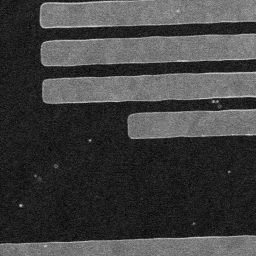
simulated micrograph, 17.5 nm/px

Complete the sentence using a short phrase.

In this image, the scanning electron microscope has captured groups of lines, slits or small figures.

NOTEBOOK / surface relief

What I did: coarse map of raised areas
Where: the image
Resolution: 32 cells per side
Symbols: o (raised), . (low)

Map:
......oooooooooooooooooooooooooo
.....ooooooooooooooooooooooooooo
.....ooooooooooooooooooooooooooo
................................
.........................ooooooo
.....ooooooooooooooooooooooooooo
.....ooooooooooooooooooooooooooo
.....ooooooooooooooooooooo......
................................
.................ooooooooooooooo
.....ooooooooooooooooooooooooooo
.....ooooooooooooooooooooooooooo
.....ooooooooooooooo............
................................
................oooooooooooooooo
................oooooooooooooooo
................oooooooooooooooo
................................
................................
................................
................................
................................
................................
................................
................................
................................
................................
................................
................................
..............................o.
..oooooooooooooooooooooooooooooo
oooooooooooooooooooooooooooooooo